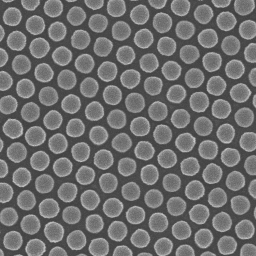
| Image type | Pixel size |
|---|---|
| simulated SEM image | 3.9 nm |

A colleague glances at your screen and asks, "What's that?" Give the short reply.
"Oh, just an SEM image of a regular array of raised bodies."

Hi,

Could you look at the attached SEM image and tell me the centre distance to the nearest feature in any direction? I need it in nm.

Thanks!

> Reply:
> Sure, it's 92.6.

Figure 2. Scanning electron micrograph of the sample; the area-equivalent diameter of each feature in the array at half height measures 75.8 nm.